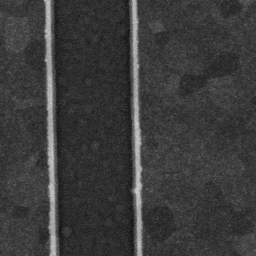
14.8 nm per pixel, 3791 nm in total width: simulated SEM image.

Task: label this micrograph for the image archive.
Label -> one or a few lines or trenches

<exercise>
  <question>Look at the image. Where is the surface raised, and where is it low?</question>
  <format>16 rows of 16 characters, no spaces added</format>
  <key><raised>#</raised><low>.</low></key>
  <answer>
###.....########
###.....########
###.....########
###.....########
###.....########
###.....########
###......#######
###......#######
###......#######
###......#######
###......#######
###......#######
###......#######
###......#######
###......#######
###......#######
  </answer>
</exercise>